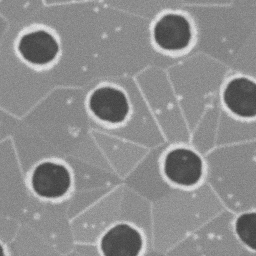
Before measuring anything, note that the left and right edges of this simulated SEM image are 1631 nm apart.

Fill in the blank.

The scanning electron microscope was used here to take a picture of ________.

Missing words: holes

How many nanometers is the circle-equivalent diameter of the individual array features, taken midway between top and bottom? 254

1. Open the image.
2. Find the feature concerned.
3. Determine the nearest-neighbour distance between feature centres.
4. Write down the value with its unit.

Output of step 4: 96 px